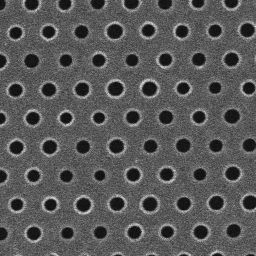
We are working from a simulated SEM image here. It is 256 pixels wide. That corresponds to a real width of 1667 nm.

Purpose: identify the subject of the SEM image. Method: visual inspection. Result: a regular array of holes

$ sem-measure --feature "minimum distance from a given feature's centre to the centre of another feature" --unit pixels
32.7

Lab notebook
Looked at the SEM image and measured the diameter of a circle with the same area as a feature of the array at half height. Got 83.5 nanometres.